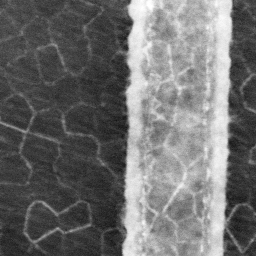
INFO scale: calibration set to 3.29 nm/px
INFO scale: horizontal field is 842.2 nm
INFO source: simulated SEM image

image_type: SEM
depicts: one or a few lines or trenches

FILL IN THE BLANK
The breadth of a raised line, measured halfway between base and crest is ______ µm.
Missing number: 0.291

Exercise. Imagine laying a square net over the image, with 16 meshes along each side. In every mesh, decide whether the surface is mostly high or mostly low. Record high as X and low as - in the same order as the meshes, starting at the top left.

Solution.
--------XXXXXX--
---------XXXXX--
---------XXXXX--
--------XXXXXX--
--------XXXXXX--
--------XXXXXX--
--------XXXXXX--
--------XXXXXX--
--------XXXXXX--
--------XXXXXX--
--------XXXXXX--
--------XXXXXX--
--------XXXXXX--
--------XXXXXX--
--------XXXXXX--
--------XXXXXX--